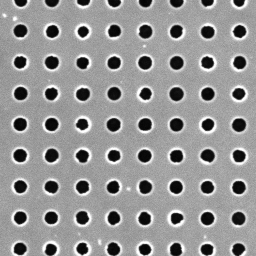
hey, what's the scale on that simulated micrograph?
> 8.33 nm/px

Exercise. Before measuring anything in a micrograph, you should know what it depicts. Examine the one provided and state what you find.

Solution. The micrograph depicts a regular array of holes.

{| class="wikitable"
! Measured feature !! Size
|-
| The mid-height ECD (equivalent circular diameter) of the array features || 112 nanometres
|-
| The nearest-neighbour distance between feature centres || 257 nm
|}